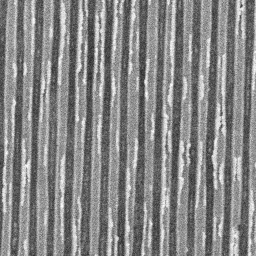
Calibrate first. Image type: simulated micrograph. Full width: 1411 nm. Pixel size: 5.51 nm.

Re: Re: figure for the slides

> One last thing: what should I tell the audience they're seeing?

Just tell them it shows parallel lines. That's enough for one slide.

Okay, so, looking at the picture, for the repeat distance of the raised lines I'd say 0.0969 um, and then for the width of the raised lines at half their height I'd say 49.6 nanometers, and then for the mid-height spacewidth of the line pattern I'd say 0.0489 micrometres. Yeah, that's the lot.